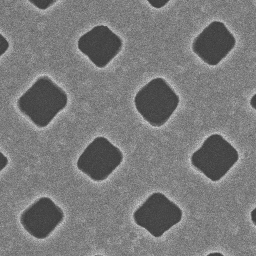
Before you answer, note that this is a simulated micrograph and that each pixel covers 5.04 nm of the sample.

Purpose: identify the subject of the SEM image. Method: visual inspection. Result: a regular array of holes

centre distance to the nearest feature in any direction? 406 nm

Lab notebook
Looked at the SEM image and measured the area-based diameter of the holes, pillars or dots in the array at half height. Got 207 nm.